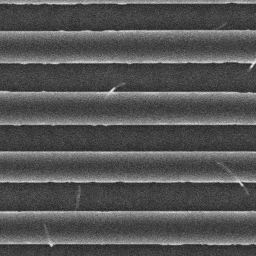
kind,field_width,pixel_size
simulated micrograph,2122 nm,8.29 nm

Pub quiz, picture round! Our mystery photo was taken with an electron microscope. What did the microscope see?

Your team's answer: lines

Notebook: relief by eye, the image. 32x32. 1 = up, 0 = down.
00000000000000000000000000000000
00000000000000000000000000000000
00000000000000000000000000000000
00000000000000000000000000000000
11111111111111111111111111111111
11111111111111111111111111111111
11111111111111111111111111111111
11111111111111111111111111111111
00000000000000000000000000000000
00000000000000000000000000000000
00000000000000000000000000000000
11000000000001100000000000000000
11111111111111111111111111111111
11111111111111111111111111111111
11111111111111111111111111111111
11111111111111111111111111111111
00000000000000000000000000000000
00000000000000000000000000000000
00000000000000000000000000000000
11111111111111111111111111111111
11111111111111111111111111111111
11111111111111111111111111111111
11111111111111111111111111111111
00000000000000000000000000000000
00000000000000000000000000000000
00000000000000000000000000000000
11111111111111111111111111111111
11111111111111111111111111111111
11111111111111111111111111111111
11111111111111111111111111111111
00000010000000000000111000111010
00000000000000000000000000000000